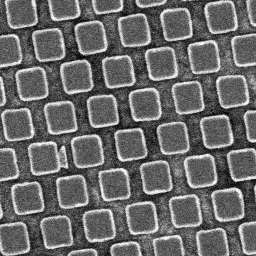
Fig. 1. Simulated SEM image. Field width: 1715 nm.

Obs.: a regular array of raised bodies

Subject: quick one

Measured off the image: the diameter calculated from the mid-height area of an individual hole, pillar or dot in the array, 32.4 pixels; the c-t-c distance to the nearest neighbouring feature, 0.286 microns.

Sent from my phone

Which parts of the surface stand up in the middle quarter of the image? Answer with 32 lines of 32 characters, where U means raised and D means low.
UUUUUUDDDDUUUUUUUDDDDUUUUUUUDDDD
UUUUUUDDDDUUUUUUUDDDDUUUUUUUDDDD
UUUUUUDDDDUUUUUUUDDDDUUUUUUUDDDD
UUUUUUUDDDUUUUUUUDDDDDUUUDDDDDDD
UUUUUUUDDDDUUUUUUDDDDDDDDDDDDDDD
UUUUUUUDDDDUUUUDDDDDDDDDDDDUUUUU
UUUUUUDDDDDDDDDDDDDDDUUDDDDUUUUU
DDDDDDDDDDDDDDDDDUUUUUUDDDDUUUUU
DDDDDDDUUUUUDDDDDUUUUUUUDDDDUUUU
UDDDDDUUUUUUUDDDDUUUUUUUDDDDUUUU
UUDDDDUUUUUUUDDDDUUUUUUUDDDDUUUU
UUDDDDUUUUUUUDDDDUUUUUUUDDDDUUUU
UUDDDDDUUUUUUDDDDUUUUUUUDDDDDDDD
UUUDDDDUUUUUUUDDDUUUUUUDDDDDDDDD
UUUDDDDUUUUUUDDDDDDDDDDDDDDDDDDD
UUUDDDDUUDDDDDDDDDDDDDDDUUUUUUDD
UUUDDDDDDDDDDDDDUUUDDDDUUUUUUUDD
DDDDDDDDDDDDDUUUUUUUDDDDUUUUUUUD
DDDUUUUUUDDDDUUUUUUUDDDDUUUUUUUD
DDUUUUUUUDDDDUUUUUUUDDDDUUUUUUUD
DDUUUUUUUDDDDUUUUUUUDDDDUUUUUUUD
DDUUUUUUUDDDDUUUUUUUDDDDUUUUUUUD
DDUUUUUUUDDDDUUUUUUUUDDDDUDDDDDD
UDDUUUUUUUDDDDUUUUUUDDDDDDDDDDDD
UDDUUUUUUUDDDDDDDDDDDDDDUDDDDDUU
DDDUUUDDDDDDDDDDDDDUUUUUUUDDDDUU
DDDDDDDDDDDUUUUDDDDUUUUUUUDDDDDU
DDDDDDDDDUUUUUUUDDDUUUUUUUUDDDDU
UUUUUDDDDUUUUUUUDDDDUUUUUUUDDDDU
UUUUUDDDDUUUUUUUDDDDUUUUUUUDDDDU
UUUUUDDDDUUUUUUUDDDDUUUUUUUDDDDD
UUUUUDDDDUUUUUUUDDDDUUUUUUDDDDDD